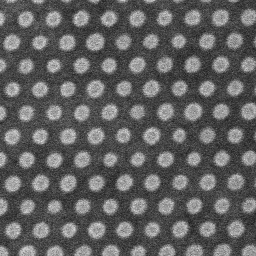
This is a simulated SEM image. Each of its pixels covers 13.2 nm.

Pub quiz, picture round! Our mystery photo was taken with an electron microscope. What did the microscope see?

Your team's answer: a regular array of raised bodies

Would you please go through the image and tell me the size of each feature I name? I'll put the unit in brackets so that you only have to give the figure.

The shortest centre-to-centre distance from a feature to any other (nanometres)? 356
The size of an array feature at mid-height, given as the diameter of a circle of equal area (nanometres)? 180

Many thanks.